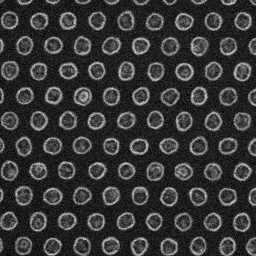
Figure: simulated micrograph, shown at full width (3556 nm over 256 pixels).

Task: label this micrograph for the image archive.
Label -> a regular array of raised bodies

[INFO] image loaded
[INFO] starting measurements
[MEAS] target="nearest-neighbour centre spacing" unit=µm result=0.393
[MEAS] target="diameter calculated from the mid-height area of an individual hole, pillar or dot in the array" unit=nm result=224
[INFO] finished